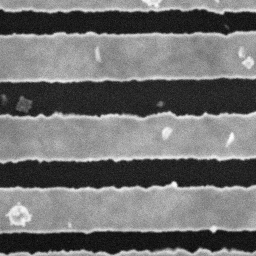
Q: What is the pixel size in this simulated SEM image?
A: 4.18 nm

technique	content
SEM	lines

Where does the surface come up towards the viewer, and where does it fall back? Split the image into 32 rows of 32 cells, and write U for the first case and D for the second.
UUUUUUUUUUUUUUUUUUUUUUUUUUUUUUUU
DUDDDUUDUDDDDDDDDDDDDDDDDDUUDUDU
DDDDDDDDDDDDDDDDDDDDDDDDDDDDDDDD
DDDDDDDDDDDDDDDDDDDDDDDDDDDDDDDD
UUUUUUUUUUUUUUUUUUUUUUUUUUUUUUUU
UUUUUUUUUUUUUUUUUUUUUUUUUUUUUUUU
UUUUUUUUUUUUUUUUUUUUUUUUUUUUUUUU
UUUUUUUUUUUUUUUUUUUUUUUUUUUUUUUU
UUUUUUUUUUUUUUUUUUUUUUUUUUUUUUUU
UUUUUUUUUUUUUUUUUUUUUUUUUUUUUUUU
DDDDDDDDDDDDDDDDDDDDDDDDDDDDDDDD
DDDDDDDDDDDDDDDDDDDDDDDDDDDDDDDD
DDDDDDDDDDDDDDDDDDDDDDDDDDDDDDDD
DDDDDDDDDDDDDDDDDDDDDDDDDDDDDDDD
UUDDDUUUDDUDDUUUDDDUUUDUDUUUUUUU
UUUUUUUUUUUUUUUUUUUUUUUUUUUUUUUU
UUUUUUUUUUUUUUUUUUUUUUUUUUUUUUUU
UUUUUUUUUUUUUUUUUUUUUUUUUUUUUUUU
UUUUUUUUUUUUUUUUUUUUUUUUUUUUUUUU
UUUUUUUUUUUUUUUUUUUUUUUUUUUUUUUU
DDDDDDDDDDDDDDDDDDDDDDDDDDDDDDDD
DDDDDDDDDDDDDDDDDDDDDDDDDDDDDDDD
DDDDDDDDDDDDDDDDDDDDDDDDDDDDDDDD
DDUDDDUUDDUDDUUUUUDUUUUUUUUDUUUU
UUUUUUUUUUUUUUUUUUUUUUUUUUUUUUUU
UUUUUUUUUUUUUUUUUUUUUUUUUUUUUUUU
UUUUUUUUUUUUUUUUUUUUUUUUUUUUUUUU
UUUUUUUUUUUUUUUUUUUUUUUUUUUUUUUU
UUUUUUUUUUUUUUUUUUUUUUUUUUUUUUUU
DDDDDDDDDDDDDDDDDDDDDDDDDDDDDDDD
DDDDDDDDDDDDDDDDDDDDDDDDDDDDDDDD
DDDDDDUUUUUDDDDUUUUDUUUUUUUUUUDD